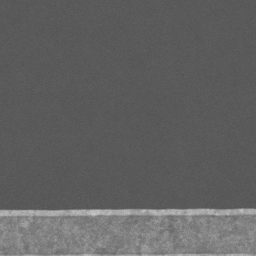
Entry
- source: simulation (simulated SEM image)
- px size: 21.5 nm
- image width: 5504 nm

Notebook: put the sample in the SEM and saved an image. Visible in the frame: wiring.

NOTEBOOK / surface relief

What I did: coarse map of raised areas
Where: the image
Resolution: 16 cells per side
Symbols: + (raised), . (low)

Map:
................
................
................
................
................
................
................
................
................
................
................
................
................
++++++++++++++++
++++++++++++++++
++++++++++++++++